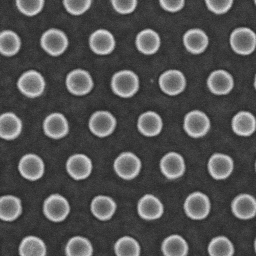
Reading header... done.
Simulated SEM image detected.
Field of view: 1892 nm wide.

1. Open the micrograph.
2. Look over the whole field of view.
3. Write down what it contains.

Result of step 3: a regular array of raised bodies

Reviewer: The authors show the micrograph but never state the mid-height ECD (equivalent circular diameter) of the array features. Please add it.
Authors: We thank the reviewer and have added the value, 179 nm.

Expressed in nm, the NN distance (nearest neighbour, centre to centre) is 344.